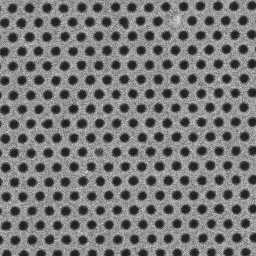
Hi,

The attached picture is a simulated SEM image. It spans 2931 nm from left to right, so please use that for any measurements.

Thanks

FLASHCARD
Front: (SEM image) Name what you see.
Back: a regular array of holes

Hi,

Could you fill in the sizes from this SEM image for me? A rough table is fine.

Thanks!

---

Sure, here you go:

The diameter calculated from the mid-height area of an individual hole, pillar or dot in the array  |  113 nanometres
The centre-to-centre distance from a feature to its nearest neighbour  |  188 nanometres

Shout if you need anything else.